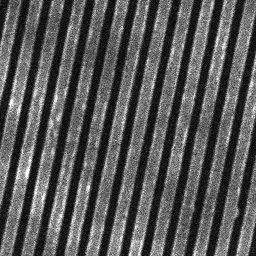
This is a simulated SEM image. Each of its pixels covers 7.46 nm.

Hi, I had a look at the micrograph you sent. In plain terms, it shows parallel lines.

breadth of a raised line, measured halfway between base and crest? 93.2 nanometres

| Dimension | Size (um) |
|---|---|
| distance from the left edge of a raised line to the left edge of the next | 0.157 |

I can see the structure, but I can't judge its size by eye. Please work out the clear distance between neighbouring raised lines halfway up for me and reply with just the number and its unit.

0.0648 micrometres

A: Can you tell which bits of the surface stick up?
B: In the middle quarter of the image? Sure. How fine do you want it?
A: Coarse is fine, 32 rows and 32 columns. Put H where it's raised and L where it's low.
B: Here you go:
HHLLHHHHLLHHHLLHHHLLHHHHLLHHHLLH
HHLLHHHLLLHHHLLHHHLLHHHLLLHHHLLH
HHLLHHHLLHHHHLLHHHLLHHHLLHHHLLLH
HHLLHHHLLHHHLLLHHLLLHHHLLHHHLLLH
HLLLHHHLLHHHLLHHHLLLHHHLLHHHLLHH
HLLHHHHLLHHHLLHHHLLHHHLLLHHHLLHH
HLLHHHLLLHHHLLHHHLLHHHLLLHHHLLHH
HLLHHHLLHHHHLLHHHLLHHHLLHHHLLLHH
LLLHHHLLHHHLLLHHLLLHHHLLHHHLLLHH
LLLHHHLLHHHLLHHHLLLHHHLLHHHLLHHH
LLHHHLLLHHHLLHHHLLHHHLLLHHHLLHHH
LLHHHLLLHHHLLHHHLLHHHLLLHHHLLHHH
LLHHHLLHHHLLLHHHLLHHHLLHHHLLLHHH
LLHHHLLHHHLLLHHLLLHHHLLHHHLLLHHH
LLHHHLLHHHLLHHHLLLHHHLLHHHLLHHHL
LHHHLLLHHHLLHHHLLHHHHLLHHHLLHHHL
LHHHLLLHHHLLHHHLLHHHLLLHHHLLHHHL
LHHHLLHHHLLLHHHLLHHHLLHHHLLLHHHL
LHHHLLHHHLLHHHLLLHHHLLHHHLLLHHHL
LHHHLLHHHLLHHHLLHHHHLLHHHLLLHHLL
HHHLLLHHHLLHHHLLHHHLLLHHHLLHHHLL
HHHLLLHHHLLHHHLLHHHLLLHHHLLHHHLL
HHHLLHHHLLLHHHLLHHHLLHHHLLLHHHLL
HHHLLHHHLLLHHHLLHHHLLHHHLLHHHHLL
HHHLLHHHLLHHHLLHHHHLLHHHLLHHHLLL
HHLLLHHHLLHHHLLHHHLLLHHHLLHHHLLH
HHLLHHHHLLHHHLLHHHLLHHHHLLHHHLLH
HHLLHHHLLLHHHLLHHHLLHHHLLLHHHLLH
HHLLHHHLLHHHHLLHHHLLHHHLLHHHHLLH
HHLLHHHLLHHHLLHHHHLLHHHLLHHHLLLH
HLLLHHHLLHHHLLHHHLLLHHHLLHHHLLHH
HLLHHHHLLHHHLLHHHLLLHHHLLHHHLLHH